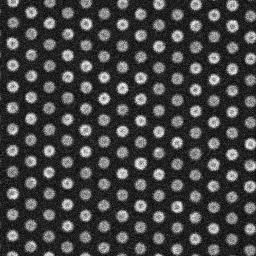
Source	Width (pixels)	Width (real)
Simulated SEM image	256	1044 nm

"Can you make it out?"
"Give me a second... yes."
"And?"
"a regular array of raised bodies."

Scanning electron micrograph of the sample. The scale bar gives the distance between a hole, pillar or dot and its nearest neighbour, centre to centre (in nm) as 85.3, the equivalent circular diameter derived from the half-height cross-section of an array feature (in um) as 0.0449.